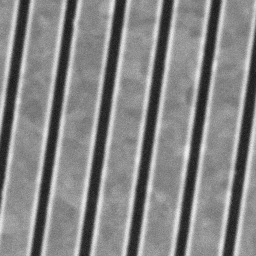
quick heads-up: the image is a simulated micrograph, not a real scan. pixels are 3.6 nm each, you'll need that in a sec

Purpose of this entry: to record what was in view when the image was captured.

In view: parallel lines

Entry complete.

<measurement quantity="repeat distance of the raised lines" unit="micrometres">0.171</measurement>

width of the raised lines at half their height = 119 nm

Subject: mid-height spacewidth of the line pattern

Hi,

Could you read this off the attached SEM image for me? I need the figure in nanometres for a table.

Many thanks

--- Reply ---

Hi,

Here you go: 52.5